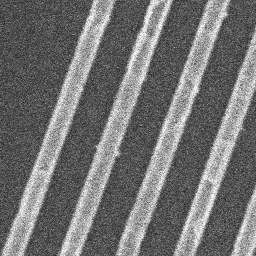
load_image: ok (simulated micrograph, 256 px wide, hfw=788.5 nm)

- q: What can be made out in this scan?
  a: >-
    parallel lines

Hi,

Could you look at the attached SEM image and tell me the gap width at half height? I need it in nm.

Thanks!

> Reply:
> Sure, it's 106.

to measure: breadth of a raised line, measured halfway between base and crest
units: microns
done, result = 0.059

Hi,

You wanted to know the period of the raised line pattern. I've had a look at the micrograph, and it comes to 0.166 microns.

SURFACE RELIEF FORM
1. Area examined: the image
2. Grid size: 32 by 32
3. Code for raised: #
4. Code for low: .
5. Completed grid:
............##.....#......##....
...........###......#.....##....
...........###....###....###....
...........##......#.....##.....
..........###....###....###.....
..........##.....###....###....#
..........##.....##.....##.....#
.........###....###....###.....#
.........##.....##.....###....##
........###.....##.....##.....##
........##.....###....###....###
........##.....##.....###....###
.......###.....##.....##.....##.
.......##.....###....###....###.
.......##.....##.....##.....###.
......###....###....###.....##..
......##.....###....###....###..
......##.....##.....##.....##...
.....###....###....###.....##...
.....##.....###....###....###...
.....##.....##.....##.....##....
....##.....###....###.....##....
....##.....##.....##.....###....
...###....###.....##.....##.....
...##.....###....###....###.....
...##.....##.....##.....###....#
..###....###....###.....##.....#
..##.....###....###....###....##
..##.....##.....##.....##.....##
.###....###....###.....##.....##
.##.....##.....##.....###....###
###.....##.....##.....##.....###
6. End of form